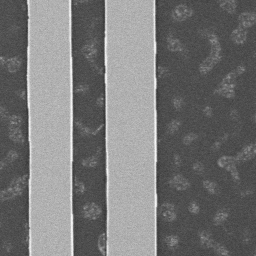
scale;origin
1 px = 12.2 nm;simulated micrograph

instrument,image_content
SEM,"one or a few lines or trenches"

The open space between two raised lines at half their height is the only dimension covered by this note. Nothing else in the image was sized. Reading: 428 nanometres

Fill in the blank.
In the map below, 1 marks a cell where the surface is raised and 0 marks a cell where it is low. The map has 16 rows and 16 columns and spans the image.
0011000111000000
0011000111000000
0011000111000000
0011000111000000
0011000111000000
0011000111000000
0011000111000000
0011000111000000
0011000111000000
0011000111000000
0011000111000000
0011000111000000
0011000111000000
0011000111000000
0011000111000000
0011000111000000